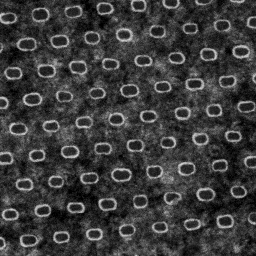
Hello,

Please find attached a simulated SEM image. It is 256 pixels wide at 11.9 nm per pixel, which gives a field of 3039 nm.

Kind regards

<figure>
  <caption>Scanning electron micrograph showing a regular array of raised bodies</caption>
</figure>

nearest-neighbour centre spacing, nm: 377